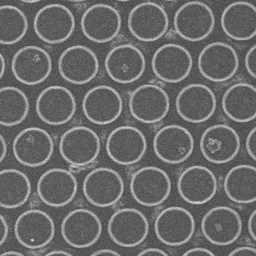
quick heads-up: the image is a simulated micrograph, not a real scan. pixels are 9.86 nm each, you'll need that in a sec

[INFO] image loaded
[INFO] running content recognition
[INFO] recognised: a regular array of raised bodies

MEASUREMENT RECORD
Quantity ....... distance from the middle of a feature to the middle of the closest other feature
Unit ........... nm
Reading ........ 459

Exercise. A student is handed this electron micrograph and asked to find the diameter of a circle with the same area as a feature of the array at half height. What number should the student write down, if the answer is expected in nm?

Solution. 364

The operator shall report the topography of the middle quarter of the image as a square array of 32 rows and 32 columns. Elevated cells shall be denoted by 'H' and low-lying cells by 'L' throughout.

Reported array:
HHHHHHHHLLLHHHHHHHHHLLHHHHHHHHHH
HHHHHHHHLLLHHHHHHHHHLLLHHHHHHHHL
HHHHHHHHLLLLHHHHHHHLLLLHHHHHHHHL
HHHHHHHLLLLLHHHHHHLLLLLLHHHHHLLL
LLHHHLLLLLLLLLLLLLLLLLLLLLLLLLLL
LLLLLLLLLLLLLLLLLLLLHHLLLLLLLLLH
HLLLLLLHHHHHLLLLLLHHHHHHLLLLLLHH
HHLLLLHHHHHHHLLLLHHHHHHHHLLLLHHH
HHLLLHHHHHHHHHLLLHHHHHHHHHLLLHHH
HHLLLHHHHHHHHHLLLHHHHHHHHHLLHHHH
HHHLLHHHHHHHHHLLLHHHHHHHHHLLHHHH
HHLLLHHHHHHHHHLLLHHHHHHHHHLLLHHH
HHLLLLHHHHHHHHLLLHHHHHHHHLLLLHHH
HLLLLLHHHHHHHLLLLLHHHHHHLLLLLLHH
LLLLLLLLHHHLLLLLLLLLLLLLLLLLLLLL
LLLLLLLLLLLLLLLLLLLLLLLLLLLLLLLL
LLHHHHLLLLLLLHHHHHLLLLLLLHHHHHLL
HHHHHHHHLLLLHHHHHHHLLLLLHHHHHHHL
HHHHHHHHLLLHHHHHHHHHLLLHHHHHHHHH
HHHHHHHHHLLHHHHHHHHHLLLHHHHHHHHH
HHHHHHHHHLLHHHHHHHHHLLLHHHHHHHHH
HHHHHHHHHLLHHHHHHHHHLLLHHHHHHHHH
HHHHHHHHLLLHHHHHHHHHLLLHHHHHHHHL
HHHHHHHLLLLLHHHHHHHLLLLLHHHHHHLL
LLHHHHLLLLLLLLHHHLLLLLLLLLLLLLLL
LLLLLLLLLLLLLLLLLLLLLLLLLLLLLLLL
LLLLLLLLHHHLLLLLLLLHHHHHLLLLLLLH
HLLLLLLHHHHHHLLLLLHHHHHHHLLLLLHH
HHLLLLHHHHHHHHLLLHHHHHHHHHLLLHHH
HHHLLHHHHHHHHHLLLHHHHHHHHHLLLHHH
HHHLLHHHHHHHHHLLLHHHHHHHHHLLLHHH
HHHLLHHHHHHHHHLLLHHHHHHHHHLLLHHH